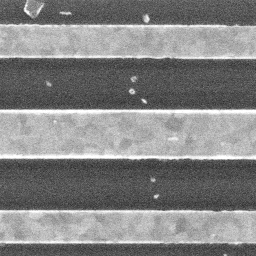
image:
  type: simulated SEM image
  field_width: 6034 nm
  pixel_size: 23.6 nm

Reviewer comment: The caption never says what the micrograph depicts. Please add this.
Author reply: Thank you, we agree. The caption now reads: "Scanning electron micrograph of lines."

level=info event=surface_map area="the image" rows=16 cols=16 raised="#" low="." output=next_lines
................
................
################
################
................
................
................
################
################
################
................
................
................
################
################
................